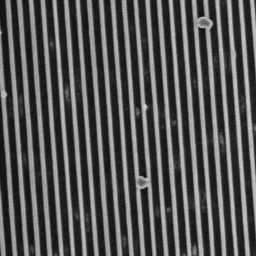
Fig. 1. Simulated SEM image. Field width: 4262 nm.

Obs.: parallel lines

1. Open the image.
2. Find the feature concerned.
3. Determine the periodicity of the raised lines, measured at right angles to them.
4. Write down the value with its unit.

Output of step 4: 193 nm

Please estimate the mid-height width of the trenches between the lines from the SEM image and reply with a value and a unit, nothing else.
127 nm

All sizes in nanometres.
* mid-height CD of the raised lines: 56